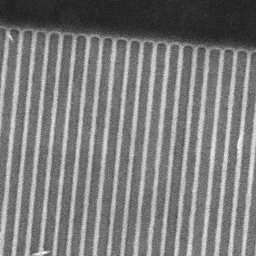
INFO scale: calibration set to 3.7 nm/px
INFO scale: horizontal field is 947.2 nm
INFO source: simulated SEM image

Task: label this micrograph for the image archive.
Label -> parallel lines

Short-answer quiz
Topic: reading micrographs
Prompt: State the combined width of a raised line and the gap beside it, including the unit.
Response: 0.0498 um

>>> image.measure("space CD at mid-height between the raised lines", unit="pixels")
9.95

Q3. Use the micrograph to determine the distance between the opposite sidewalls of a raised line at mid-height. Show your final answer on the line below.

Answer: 13.4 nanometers